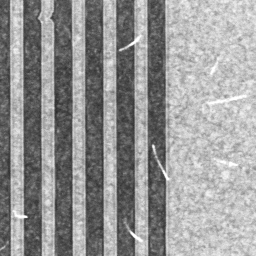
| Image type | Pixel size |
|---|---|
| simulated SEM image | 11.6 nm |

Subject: parallel lines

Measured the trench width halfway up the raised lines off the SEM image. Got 224 nm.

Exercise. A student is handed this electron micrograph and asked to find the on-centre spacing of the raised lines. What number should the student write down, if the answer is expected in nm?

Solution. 360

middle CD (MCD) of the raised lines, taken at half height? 139 nm